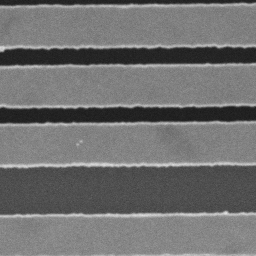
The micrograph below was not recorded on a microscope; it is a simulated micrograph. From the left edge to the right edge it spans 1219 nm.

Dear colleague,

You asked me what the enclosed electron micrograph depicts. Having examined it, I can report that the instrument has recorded lines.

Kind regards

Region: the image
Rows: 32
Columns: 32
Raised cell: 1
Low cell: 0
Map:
00000000000000000000000000000111
11111111111111111111111111111111
11111111111111111111111111111111
11111111111111111111111111111111
11111111111111111111111111111111
11111111111111111111111111111111
00000000000000000000000000000000
00000000000000000000000000000000
11111111111111111111111111111111
11111111111111111111111111111111
11111111111111111111111111111111
11111111111111111111111111111111
11111111111111111111111111111111
01111111111000000000000000000000
00000000000000000000000000000000
11011111111111111111111111111111
11111111111111111111111111111111
11111111111111111111111111111111
11111111111111111111111111111111
11111111111111111111111111111111
11111111111111111111111111111111
00000000000000000000000000000000
00000000000000000000000000000000
00000000000000000000000000000000
00000000000000000000000000000000
00000000000000000000000000000000
00000000000000000000000000000000
11111111111111111111111111111111
11111111111111111111111111111111
11111111111111111111111111111111
11111111111111111111111111111111
11111111111111111111111111111111